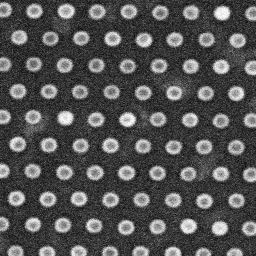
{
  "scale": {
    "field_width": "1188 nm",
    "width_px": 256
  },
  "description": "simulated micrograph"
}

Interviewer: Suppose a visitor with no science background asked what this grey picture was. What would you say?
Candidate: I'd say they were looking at a regular array of raised bodies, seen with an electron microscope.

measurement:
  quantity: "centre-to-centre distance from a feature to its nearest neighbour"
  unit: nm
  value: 141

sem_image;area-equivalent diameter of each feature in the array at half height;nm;62.1